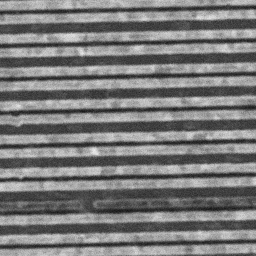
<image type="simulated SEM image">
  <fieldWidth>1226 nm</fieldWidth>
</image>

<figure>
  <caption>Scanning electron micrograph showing parallel lines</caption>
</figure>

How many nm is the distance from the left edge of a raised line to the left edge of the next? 80.3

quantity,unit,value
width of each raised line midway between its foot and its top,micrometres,0.0305